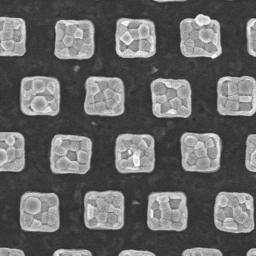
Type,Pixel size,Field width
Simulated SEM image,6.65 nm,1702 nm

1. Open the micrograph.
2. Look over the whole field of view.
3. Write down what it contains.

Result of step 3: a regular array of raised bodies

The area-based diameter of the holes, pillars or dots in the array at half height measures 284 nm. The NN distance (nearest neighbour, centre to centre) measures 0.425 um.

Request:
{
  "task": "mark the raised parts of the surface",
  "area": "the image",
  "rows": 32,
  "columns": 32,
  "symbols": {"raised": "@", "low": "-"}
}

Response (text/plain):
--------------------------------
--------------------------------
@@@------------@@------@@@@----@
@@@----@@@@@---@@@@----@@@@----@
@@@----@@@@@--@@@@@----@@@@----@
@@@----@@@@@---@@@@----@@@@@---@
@@@----@@@@@---@@@@----@@@@@---@
--------------------------------
--------------------------------
--------------------------------
---@@@@----@@@@----@@@@@---@@@@@
---@@@@@---@@@@----@@@@@---@@@@@
---@@@@----@@@@@---@@@@@---@@@@@
---@@@@----@@@@@---@@@@@---@@@@@
--------------------@@@---------
--------------------------------
--------------------------------
@@@----@@@@----@@@@----@@@@----@
@@@---@@@@@---@@@@@----@@@@@---@
@@@---@@@@@---@@@@@----@@@@----@
@@@---@@@@@----@@@@----@@@@----@
-------@@@@----@@@--------------
--------------------------------
--------------------------------
---@@@@----@@@@----@@@@----@@@@-
---@@@@----@@@@----@@@@----@@@@@
---@@@@----@@@@---@@@@@----@@@@@
---@@@@----@@@@---@@@@@----@@@@@
---@@@@----@@@@----@@@@----@@@@@
--------------------------------
--------------------------------
@@@----@@@@----@@@@----@@@@----@